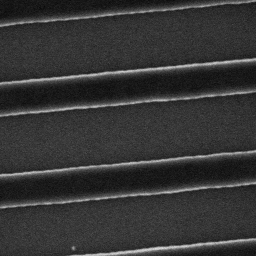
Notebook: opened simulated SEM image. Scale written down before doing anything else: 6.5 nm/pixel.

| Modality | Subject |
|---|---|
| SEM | lines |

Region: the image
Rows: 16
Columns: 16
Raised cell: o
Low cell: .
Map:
oooooooooooo....
o...............
................
................
.......ooooooooo
oooooooooooooooo
oooooooo........
................
................
...............o
.....ooooooooooo
oooooooooooooooo
oooooo..........
................
................
..........oooooo